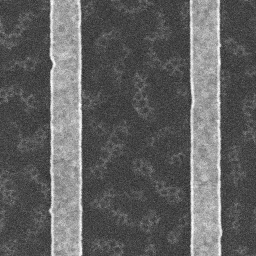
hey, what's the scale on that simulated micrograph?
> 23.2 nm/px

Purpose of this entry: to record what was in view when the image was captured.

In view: one or a few lines or trenches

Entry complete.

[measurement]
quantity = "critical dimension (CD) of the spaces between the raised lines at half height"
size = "2580 nanometers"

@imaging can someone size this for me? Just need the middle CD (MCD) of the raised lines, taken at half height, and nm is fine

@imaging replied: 639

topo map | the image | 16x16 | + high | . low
...++.......++..
...++.......++..
...++.......++..
...++.......++..
...++.......++..
...++.......++..
...++.......++..
...++.......++..
...++.......++..
...++.......++..
...++.......++..
...++.......++..
...++.......++..
...++.......++..
...++.......++..
...++.......++..